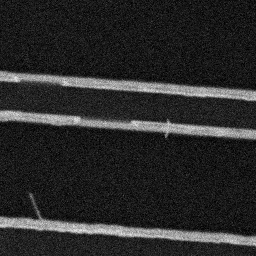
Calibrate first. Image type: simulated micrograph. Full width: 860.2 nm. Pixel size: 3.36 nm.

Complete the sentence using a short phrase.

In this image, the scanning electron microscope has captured one or a few lines or trenches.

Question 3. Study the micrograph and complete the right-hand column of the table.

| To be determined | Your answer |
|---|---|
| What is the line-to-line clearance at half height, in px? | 101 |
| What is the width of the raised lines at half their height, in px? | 42.8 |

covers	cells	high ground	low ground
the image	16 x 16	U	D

DDDDDDDDDDDDDDDD
DDDDDDDDDDDDDDDD
DDDDDDDDDDDDDDDD
DDDDDDDDDDDDDDDD
DDDDDDDDDDDDDDDD
UUUUUUUUUUUDDDDD
UUUUUUUUUUUUUUUU
UDUUUUUUUUUUUUUU
DDDDDDDDDDDDDDDU
DDDDDDDDDDDDDDDD
DDDDDDDDDDDDDDDD
DDDDDDDDDDDDDDDD
DDDDDDDDDDDDDDDD
DDDDDDDDDDDDDDDD
UUUUUUUUUUDDDDDD
UUUUUUUUUUUUUUUU